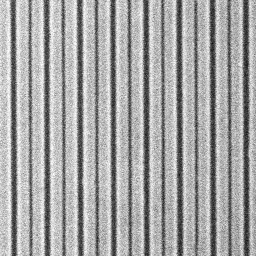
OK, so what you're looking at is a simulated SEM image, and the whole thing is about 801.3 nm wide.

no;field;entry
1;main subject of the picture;parallel lines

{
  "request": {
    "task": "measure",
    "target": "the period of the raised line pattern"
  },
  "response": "51.5 nm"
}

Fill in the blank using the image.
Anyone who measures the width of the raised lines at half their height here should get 36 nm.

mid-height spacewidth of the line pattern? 19.2 nanometres